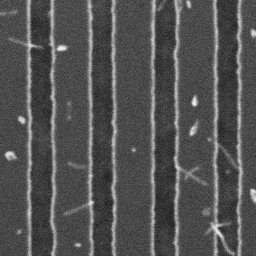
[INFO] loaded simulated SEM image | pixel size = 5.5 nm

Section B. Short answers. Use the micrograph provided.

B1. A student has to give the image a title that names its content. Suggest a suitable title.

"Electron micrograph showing lines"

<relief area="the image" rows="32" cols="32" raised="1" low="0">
11110011111000111110001111100011
11110011111000111110001111100011
11110011111000111110001111100011
11110011111000111110001111100011
11110011111000111110001111100011
11110011111000111110001111100011
11110001111000111110001111100011
11110001111000111110001111100011
11110011111000111110001111100011
11110011111000111110001111100011
11110011111000111110001111100011
11110001111000111110001111100011
11110001111000111110001111100011
11110001111000111110001111100011
11110001111000111110001111100011
11110011111000111110001111100011
11110001111000111110001111100011
11110001111000111110001111100011
11110001111000111110001111100011
11110001111000111110001111100011
11110001111000111110001111100011
11110001111000111110001111100011
11110001111000111110001111100011
11110001111000111110001111100011
11110001111000111110001111100011
11110011111100111110001111100011
11110011111000111110001111100011
11110011111100111110001111100011
11110001111000111110001111100011
11110001111000111110001111100011
11110001111100111110001111100011
11110001111100111110001111100011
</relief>